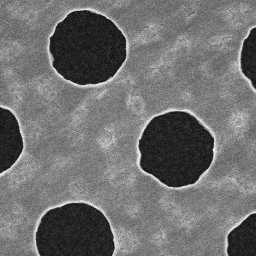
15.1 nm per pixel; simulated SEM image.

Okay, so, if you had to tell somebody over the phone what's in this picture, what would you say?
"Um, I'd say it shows holes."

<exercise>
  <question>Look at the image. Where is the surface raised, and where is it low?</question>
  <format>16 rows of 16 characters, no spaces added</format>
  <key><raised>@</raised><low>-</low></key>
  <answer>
@@@@@@@@@@@@@@@@
@@@@---@@@@@@@@@
@@@-----@@@@@@@-
@@@-----@@@@@@@-
@@@@---@@@@@@@@-
@@@@@@@@@@@@@@@@
@@@@@@@@@@@@@@@@
-@@@@@@@@---@@@@
-@@@@@@@@----@@@
-@@@@@@@@----@@@
-@@@@@@@@----@@@
@@@@@@@@@@--@@@@
@@@@@@@@@@@@@@@@
@@@----@@@@@@@@@
@@-----@@@@@@@--
@@-----@@@@@@@--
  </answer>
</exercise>